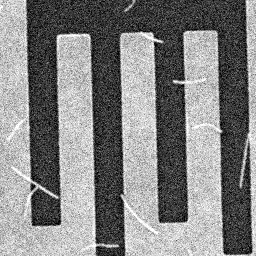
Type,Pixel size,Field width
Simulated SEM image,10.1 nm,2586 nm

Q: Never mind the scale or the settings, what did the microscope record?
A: groups of lines, slits or small figures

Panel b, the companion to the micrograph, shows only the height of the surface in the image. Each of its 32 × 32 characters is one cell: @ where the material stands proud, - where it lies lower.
@@@----------------------------@
@@@----------------------------@
@@@----------------------------@
@@@----------------------------@
@@@------@@----@@@@----@@@@----@
@@@----@@@@----@@@@----@@@@----@
@@@----@@@@----@@@@----@@@@----@
@@@----@@@@----@@@@----@@@@----@
@@@----@@@@----@@@@----@@@@----@
@@@----@@@@----@@@@----@@@@----@
@@@----@@@@----@@@@----@@@@----@
@@@----@@@@----@@@@----@@@@----@
@@@----@@@@----@@@@----@@@@----@
@@@----@@@@----@@@@----@@@@----@
@@@----@@@@----@@@@----@@@@----@
@@@@---@@@@----@@@@----@@@@----@
@@@@---@@@@----@@@@----@@@@----@
@@@@---@@@@----@@@@----@@@@----@
@@@@---@@@@@---@@@@@---@@@@----@
@@@@---@@@@@----@@@@---@@@@----@
@@@@----@@@@----@@@@---@@@@----@
@@@@----@@@@----@@@@---@@@@@---@
@@@@----@@@@----@@@@----@@@@---@
@@@@----@@@@----@@@@----@@@@---@
@@@@----@@@@---@@@@@----@@@@---@
@@@@----@@@@----@@@@----@@@@---@
@@@@----@@@@----@@@@----@@@@----
@@@@----@@@@----@@@@----@@@@----
@@@@@@@@@@@@----@@@@@@@@@@@@----
@@@@@@@@@@@@----@@@@@@@@@@@@----
@@@@@@@@@@@@----@@@@@@@@@@@@----
@@@@@@@@@@@@----@@@@@@@@@@@@----